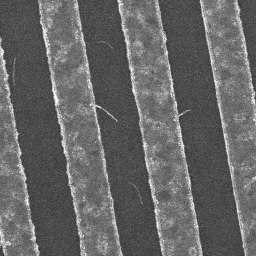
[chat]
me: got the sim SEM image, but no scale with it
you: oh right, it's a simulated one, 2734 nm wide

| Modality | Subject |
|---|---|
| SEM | one or a few lines or trenches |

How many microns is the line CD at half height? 0.401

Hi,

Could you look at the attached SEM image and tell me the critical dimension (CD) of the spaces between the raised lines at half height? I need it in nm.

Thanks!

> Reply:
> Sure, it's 460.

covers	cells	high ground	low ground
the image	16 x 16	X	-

--XXX--XXX---XX-
---XX---XX---XX-
---XX---XX---XX-
---XX---XX---XX-
---XXX--XXX--XXX
X--XXX--XXX---XX
X---XX---XX---XX
X---XX---XX---XX
X---XX---XX---XX
X---XX---XX---XX
X---XXX--XXX--XX
XX--XXX--XXX---X
XX---XX---XX---X
XX---XX---XX---X
XX---XX---XX---X
XX---XXX--XXX--X